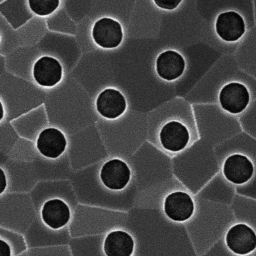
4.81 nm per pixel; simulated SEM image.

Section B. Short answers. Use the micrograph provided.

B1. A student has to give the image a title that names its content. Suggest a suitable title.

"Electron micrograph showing a regular array of holes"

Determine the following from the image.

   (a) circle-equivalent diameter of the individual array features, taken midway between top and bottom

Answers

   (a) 144 nanometers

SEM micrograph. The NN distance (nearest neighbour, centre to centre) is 339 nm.